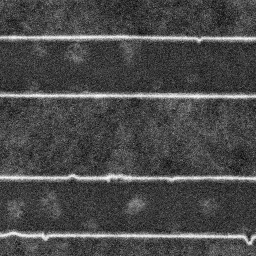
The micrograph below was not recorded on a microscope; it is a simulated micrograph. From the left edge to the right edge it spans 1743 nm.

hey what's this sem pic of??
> one or a few lines or trenches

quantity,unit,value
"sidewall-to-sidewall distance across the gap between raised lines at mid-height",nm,397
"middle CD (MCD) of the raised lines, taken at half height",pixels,82.2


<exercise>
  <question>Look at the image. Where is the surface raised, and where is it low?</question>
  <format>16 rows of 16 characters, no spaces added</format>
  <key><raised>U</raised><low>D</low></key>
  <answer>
UUUUUUUUUUUUUUUU
UUUUUUUUUUUUUUUU
DDDDDDDDDDDDDDDD
DDDDDDDDDDDDDDDD
DDDDDDDDDDDDDDDD
DDDDDDDDDDDDDDDD
UUUUUUUUUUUUUUUU
UUUUUUUUUUUUUUUU
UUUUUUUUUUUUUUUU
UUUUUUUUUUUUUUUU
UUUUUUUUUUUUUUUU
DDDDDDDDDDDDDDDD
DDDDDDDDDDDDDDDD
DDDDDDDDDDDDDDDD
DDDDDDDDDDDDDDDD
UUUUUUUUUUUUUUUU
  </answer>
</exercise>